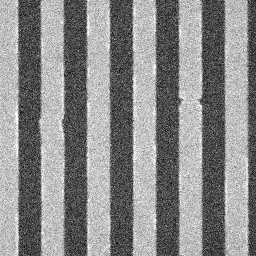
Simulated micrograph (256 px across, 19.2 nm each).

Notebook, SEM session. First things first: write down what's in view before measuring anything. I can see parallel lines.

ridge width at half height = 22.3 pixels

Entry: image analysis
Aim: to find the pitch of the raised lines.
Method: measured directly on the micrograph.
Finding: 884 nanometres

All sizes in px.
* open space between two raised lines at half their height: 23.8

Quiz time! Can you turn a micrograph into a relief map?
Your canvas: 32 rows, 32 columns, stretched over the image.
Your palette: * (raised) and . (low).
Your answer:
**...***...***...**....**...***.
**...***...***...**....**...***.
**...***...***...**....**...***.
**...***...***...**....**...***.
**...***...***...**....**...***.
**...***...***...**....**...***.
**...***...***...**....**...***.
**...***...***...**....**...***.
**...***...***...**....**...***.
**...***...***...**....**...***.
**...***...***...**...***...***.
**...***...***...**...***...***.
**...***...***...**....**...***.
**...***...***...**...***...***.
**...***...***...**...***...***.
**...***...***...**...***...***.
**...***...***...**...***...***.
**...***...***...**...***...***.
**...***...***...**...***...***.
**...***...***...**....**...***.
**...***...***...**...***...***.
**...***...***...**...***...***.
**...***...***...**...***...***.
**...***...***...**...***...***.
**...***...***...**....**...***.
**...***...***...**....**...***.
**...***...***...**....**...***.
**...***...***...**....**...***.
**...***...***...**....**...***.
**...***...***...**....**...***.
**...***...***...**....**...***.
**...***...***...**....**...***.